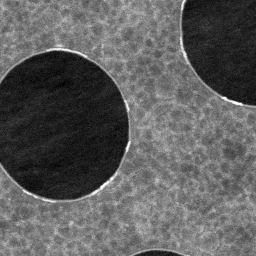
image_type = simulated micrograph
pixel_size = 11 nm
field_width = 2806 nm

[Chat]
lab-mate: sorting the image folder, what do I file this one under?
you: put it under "holes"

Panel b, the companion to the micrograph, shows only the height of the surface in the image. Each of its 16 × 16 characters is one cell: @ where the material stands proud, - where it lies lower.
@@@@@@@@@@@-----
@@@@@@@@@@@-----
@@@@@@@@@@@-----
@@---@@@@@@@----
@------@@@@@----
-------@@@@@@---
--------@@@@@@@-
--------@@@@@@@@
--------@@@@@@@@
--------@@@@@@@@
-------@@@@@@@@@
@-----@@@@@@@@@@
@@@-@@@@@@@@@@@@
@@@@@@@@@@@@@@@@
@@@@@@@@@@@@@@@@
@@@@@@@@@@@@@@@@